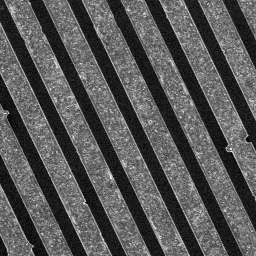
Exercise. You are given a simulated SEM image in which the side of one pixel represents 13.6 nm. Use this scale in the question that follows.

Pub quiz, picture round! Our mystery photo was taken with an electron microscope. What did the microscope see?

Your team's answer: parallel lines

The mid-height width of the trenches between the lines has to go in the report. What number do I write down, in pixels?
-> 13.5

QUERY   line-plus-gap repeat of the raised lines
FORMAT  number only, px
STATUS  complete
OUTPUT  34.9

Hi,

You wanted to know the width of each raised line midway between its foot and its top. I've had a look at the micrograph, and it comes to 288 nm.